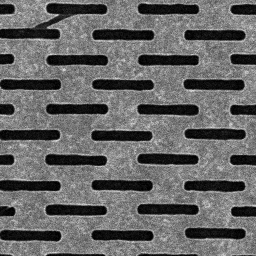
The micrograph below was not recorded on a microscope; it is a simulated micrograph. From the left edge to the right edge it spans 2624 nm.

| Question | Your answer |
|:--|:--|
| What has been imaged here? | a regular array of holes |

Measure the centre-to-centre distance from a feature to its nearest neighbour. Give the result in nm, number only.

508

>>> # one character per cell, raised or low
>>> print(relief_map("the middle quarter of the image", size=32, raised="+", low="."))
++++++....++++++++++...+.....+++
++++++++++++++++++++++++++++++++
++++++++++++++++++++++++++++++++
++++++++++++++++++++++++++++++++
+++++++...............++++++++..
+++++++................+++++++..
++++++++++....+++.....+++++++++.
++++++++++++++++++++++++++++++++
++++++++++++++++++++++++++++++++
++++++++++++++++++++++++++++++++
...........+++++++..............
...........+++++++..............
...........++++++++.............
++++++++++++++++++++++++++++++++
++++++++++++++++++++++++++++++++
++++++++++++++++++++++++++++++++
+++++++++++++++++++++++++++++++.
+++++++...............++++++++..
+++++++...............+++++++++.
++++++++++++++++++++++++++++++++
++++++++++++++++++++++++++++++++
++++++++++++++++++++++++++++++++
+++++++++++++++++++........+++++
...........+++++++..............
...........+++++++..............
....+++...++++++++++++++++++++++
++++++++++++++++++++++++++++++++
++++++++++++++++++++++++++++++++
++++++++++++++++++++++++++++++++
+++++++...............++++++++..
+++++++...............++++++++..
+++++++...............++++++++..